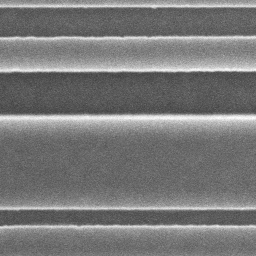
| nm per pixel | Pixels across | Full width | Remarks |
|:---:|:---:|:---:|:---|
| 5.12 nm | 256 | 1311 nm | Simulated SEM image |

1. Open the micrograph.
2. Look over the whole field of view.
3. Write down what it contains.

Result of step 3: lines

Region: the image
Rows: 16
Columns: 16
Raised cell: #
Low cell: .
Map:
################
################
################
################
................
................
................
################
################
################
################
################
################
################
################
################